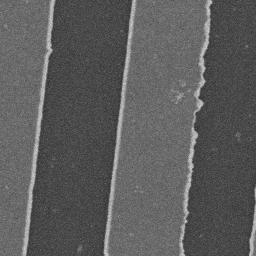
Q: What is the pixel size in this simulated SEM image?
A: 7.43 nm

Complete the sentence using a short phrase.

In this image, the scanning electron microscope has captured one or a few lines or trenches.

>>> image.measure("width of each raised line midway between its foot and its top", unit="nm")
565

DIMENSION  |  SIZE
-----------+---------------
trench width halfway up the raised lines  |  80 px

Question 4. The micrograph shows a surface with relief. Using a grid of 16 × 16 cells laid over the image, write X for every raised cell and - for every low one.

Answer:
XXX-----XXXXX---
XXX-----XXXXX---
XXX-----XXXXX---
XXX-----XXXXX---
XXX-----XXXXX---
XXX-----XXXXX---
XXX-----XXXX----
XX------XXXX----
XX-----XXXXX----
XX-----XXXXX----
XX-----XXXXX----
XX-----XXXXX----
XX-----XXXXX----
XX-----XXXXX----
XX-----XXXX-----
XX-----XXXX-----